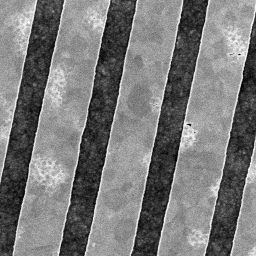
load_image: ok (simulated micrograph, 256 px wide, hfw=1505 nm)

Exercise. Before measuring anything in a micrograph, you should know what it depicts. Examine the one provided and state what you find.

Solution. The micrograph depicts one or a few lines or trenches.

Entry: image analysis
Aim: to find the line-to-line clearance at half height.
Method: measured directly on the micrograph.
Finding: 154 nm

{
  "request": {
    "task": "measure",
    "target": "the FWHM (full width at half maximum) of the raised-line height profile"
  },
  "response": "264 nm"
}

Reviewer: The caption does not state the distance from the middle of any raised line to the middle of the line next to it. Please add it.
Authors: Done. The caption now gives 420 nm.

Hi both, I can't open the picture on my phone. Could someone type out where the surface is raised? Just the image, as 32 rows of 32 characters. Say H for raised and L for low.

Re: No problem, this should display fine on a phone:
HHHHLLLLHHHHHHLLLHHHHHHLLLHHHHHH
HHHHLLLLHHHHHLLLLHHHHHHLLLHHHHHH
HHHHLLLLHHHHHLLLLHHHHHLLLLHHHHHH
HHHHLLLHHHHHHLLLLHHHHHLLLHHHHHHL
HHHHLLLHHHHHHLLLHHHHHHLLLHHHHHHL
HHHLLLLHHHHHHLLLHHHHHHLLLHHHHHHL
HHHLLLLHHHHHLLLLHHHHHHLLLHHHHHHL
HHHLLLHHHHHHLLLLHHHHHLLLLHHHHHHL
HHHLLLHHHHHHLLLHHHHHHLLLHHHHHHLL
HHHLLLHHHHHHLLLHHHHHHLLLHHHHHHLL
HHLLLLHHHHHHLLLHHHHHHLLLHHHHHHLL
HHLLLLHHHHHLLLLHHHHHLLLLHHHHHHLL
HHLLLHHHHHHLLLLHHHHHLLLLHHHHHHLL
HHLLLHHHHHHLLLLHHHHHLLLHHHHHHLLL
HHLLLHHHHHHLLLHHHHHHLLLHHHHHHLLL
HLLLLHHHHHHLLLHHHHHHLLLHHHHHHLLL
HLLLLHHHHHLLLLHHHHHHLLLHHHHHHLLL
HLLLHHHHHHLLLLHHHHHLLLLHHHHHHLLL
HLLLHHHHHHLLLHHHHHHLLLHHHHHHLLLL
HLLLHHHHHHLLLHHHHHHLLLHHHHHHLLLL
LLLLHHHHHHLLLHHHHHHLLLHHHHHHLLLH
LLLLHHHHHLLLLHHHHHLLLLHHHHHHLLLH
LLLHHHHHHLLLLHHHHHLLLLHHHHHHLLLH
LLLHHHHHHLLLHHHHHHLLLHHHHHHLLLLH
LLLHHHHHHLLLHHHHHHLLLHHHHHHLLLHH
LLLHHHHHHLLLHHHHHHLLLHHHHHHLLLHH
LLLHHHHHLLLLHHHHHHLLLHHHHHHLLLHH
LLHHHHHHLLLLHHHHHLLLLHHHHHLLLLHH
LLHHHHHHLLLHHHHHHLLLHHHHHHLLLLHH
LLHHHHHHLLLHHHHHHLLLHHHHHHLLLHHH
LLHHHHHHLLLHHHHHHLLLHHHHHHLLLHHH
LLHHHHHLLLLHHHHHLLLLHHHHHHLLLHHH